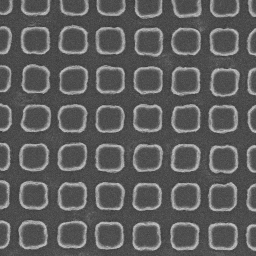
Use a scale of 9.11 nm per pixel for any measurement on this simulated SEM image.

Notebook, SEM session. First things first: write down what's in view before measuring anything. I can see a regular array of raised bodies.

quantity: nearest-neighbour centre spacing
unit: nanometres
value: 340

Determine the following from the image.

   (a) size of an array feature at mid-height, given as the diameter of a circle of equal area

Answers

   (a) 259 nm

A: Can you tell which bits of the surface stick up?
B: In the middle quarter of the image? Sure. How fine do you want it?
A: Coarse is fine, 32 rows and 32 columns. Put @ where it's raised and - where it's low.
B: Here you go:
--------------------------------
@@@@@@---@@@@@----@@@@@@----@@@@
@@@@@@--@@@@@@@---@@@@@@---@@@@@
@@@@@@--@@@@@@@---@@@@@@---@@@@@
@@@@@---@@@@@@@---@@@@@@---@@@@@
@@@@@---@@@@@@@---@@@@@@---@@@@@
@@@@@----@@@@@----@@@@@@---@@@@@
----------------------------@@--
--------------------------------
--------------------------------
--@@------@@@-----@@-----------@
@@@@@---@@@@@@----@@@@@@----@@@@
@@@@@---@@@@@@@---@@@@@@---@@@@@
@@@@@---@@@@@@@---@@@@@@---@@@@@
@@@@@---@@@@@@@---@@@@@@---@@@@@
@@@@@---@@@@@@@---@@@@@@---@@@@@
@@@@-----@@@@@-------@@@----@@@@
--------------------------------
--------------------------------
--------------------------------
@@@@@----@@@@@-----@@@@@-----@@@
@@@@@@--@@@@@@@---@@@@@@----@@@@
@@@@@@--@@@@@@@---@@@@@@---@@@@@
@@@@@@--@@@@@@@---@@@@@@---@@@@@
@@@@@---@@@@@@@---@@@@@@---@@@@@
@@@@@---@@@@@@@---@@@@@@---@@@@@
@@--------@@@@-----@--------@@@@
--------------------------------
--------------------------------
--------------------------------
@@@@@----@@@@@----@@@@@-----@@@@
@@@@@---@@@@@@@---@@@@@@---@@@@@